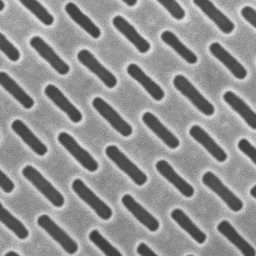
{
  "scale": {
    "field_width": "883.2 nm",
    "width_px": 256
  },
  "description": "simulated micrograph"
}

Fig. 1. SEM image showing a regular array of holes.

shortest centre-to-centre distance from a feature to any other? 167 nanometres